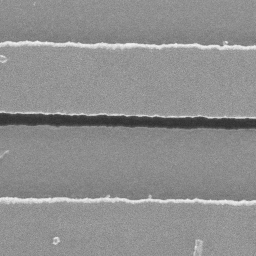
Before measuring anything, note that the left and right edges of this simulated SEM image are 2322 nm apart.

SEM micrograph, lines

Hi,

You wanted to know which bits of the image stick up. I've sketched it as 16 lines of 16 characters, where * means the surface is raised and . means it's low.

................
................
................
****************
****************
****************
****************
................
................
................
................
................
*************...
****************
****************
****************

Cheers